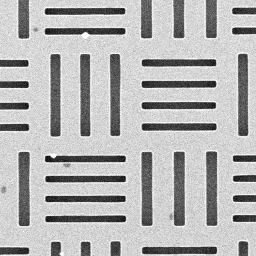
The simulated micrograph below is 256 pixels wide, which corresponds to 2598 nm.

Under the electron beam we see groups of lines, slits or small figures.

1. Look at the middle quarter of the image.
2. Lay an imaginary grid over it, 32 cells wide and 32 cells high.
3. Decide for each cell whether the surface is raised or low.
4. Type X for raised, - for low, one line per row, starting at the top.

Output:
XXXX---XXXX---XXXXXX------------
XXXX---XXXX---XXXXXXXXXXXXXXXXXX
XXXX---XXXX---XXXXXXXXXXXXXXXXXX
XXXX---XXXX---XXXXXXXXXXXXXXXXXX
XXXX---XXXX---XXXXXX------------
XXXX---XXXX---XXXXX-------------
XXXX---XXXX---XXXXXXXXXXXXXXXXXX
XXXX---XXXX---XXXXXXXXXXXXXXXXXX
XXXX---XXXX---XXXXXXXXXXXXXXXXXX
XXXX---XXXX---XXXXXX------------
XXXX---XXXX---XXXXX-------------
XXXX---XXXX---XXXXXX--XXXXX--XXX
XXXX---XXXX---XXXXXXXXXXXXXXXXXX
XXXX---XXXX---XXXXXXXXXXXXXXXXXX
XXXX---XXXX---XXXXXXXXXXXXXXXXXX
XXXX---XXXX---XXXXX-------------
XXXX---XXXX---XXXXXX------------
XXXX---XXXX---XXXXXXXXXXXXXXXXXX
XXXXXXXXXXXXXXXXXXXXXXXXXXXXXXXX
XXXXXXXXXXXXXXXXXXXXXXXXXXXXXXXX
XXXXXXXXXXXXXXXXXXXXXXXXXXXXXXXX
XXXXXXXXXXXXXXXXXXXXXXXXXXXXXXXX
XXXXXXXXXXXXXXXXXXX---XXXXX---XX
----------------XXX---XXXXX---XX
---------------XXXX---XXXXX---XX
XXXXXXXXXXXXXXXXXXX---XXXXX---XX
XXXXXXXXXXXXXXXXXXX---XXXXX---XX
XXXXXXXXXXXXXXXXXXX---XXXXX---XX
----------------XXX---XXXXX---XX
---------------XXXX---XXXXX---XX
XXXXXXXXXXXXXXXXXXX---XXXXX---XX
XXXXXXXXXXXXXXXXXXX---XXXXX---XX